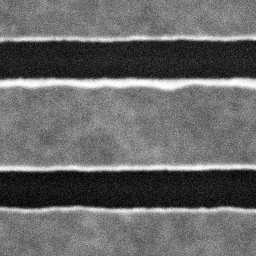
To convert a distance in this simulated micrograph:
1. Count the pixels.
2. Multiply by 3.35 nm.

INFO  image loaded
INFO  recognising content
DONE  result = lines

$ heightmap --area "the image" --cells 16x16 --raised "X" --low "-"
XXXXXXXXXXXXXXXX
XXXXXXXXXXXXXXXX
XXXXXXXXX----XX-
----------------
----------------
XXXXXXXXXXXXXXXX
XXXXXXXXXXXXXXXX
XXXXXXXXXXXXXXXX
XXXXXXXXXXXXXXXX
XXXXXXXXXXXXXXXX
XXXXXXXXXXXXXXXX
----------------
----------------
XXXXXXXXXXXXXXXX
XXXXXXXXXXXXXXXX
XXXXXXXXXXXXXXXX